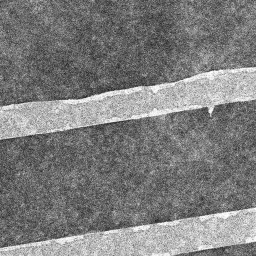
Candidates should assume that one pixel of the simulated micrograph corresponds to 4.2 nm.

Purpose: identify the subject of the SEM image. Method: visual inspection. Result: one or a few lines or trenches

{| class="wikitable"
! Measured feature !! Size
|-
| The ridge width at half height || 132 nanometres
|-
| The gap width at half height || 450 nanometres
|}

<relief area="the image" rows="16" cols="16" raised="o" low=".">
................
................
................
................
.............ooo
........oooooooo
.ooooooooooooo..
oooooooo........
o...............
................
................
................
................
.............ooo
......oooooooooo
ooooooooooooo...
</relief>